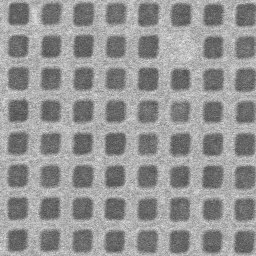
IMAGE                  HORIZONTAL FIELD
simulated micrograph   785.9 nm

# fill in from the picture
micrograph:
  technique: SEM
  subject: a regular array of holes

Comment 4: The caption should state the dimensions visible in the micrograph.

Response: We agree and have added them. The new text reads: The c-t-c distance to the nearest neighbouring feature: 0.0984 microns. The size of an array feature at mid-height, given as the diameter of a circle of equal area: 0.0749 um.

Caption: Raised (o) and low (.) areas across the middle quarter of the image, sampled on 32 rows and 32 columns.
oooooooooooooooooooooooooooooooo
oo.....oooo.....ooo.....ooo.....
oo......oo......oo......oo......
oo......oo......oo......oo......
oo......oo......oo......oo......
oo.....ooo......oo......oo......
ooo...ooooo....oooo....oooo....o
oooooooooooooooooooooooooooooooo
oooooooooooooooooooooooooooooooo
ooo....oooo....oooo....oooo.....
oo......oo......oo......oo......
oo......oo......oo......oo......
oo......oo......oo......oo......
oo......oo.....ooo.....ooo......
oo.....ooo.....ooo.....ooo.....o
oooooooooooooooooooooooooooooooo
oooooooooooooooooooooooooooooooo
oo.....oooo....oooo....ooooo...o
oo.....ooo......oo......oo......
oo.....ooo.....ooo......oo......
oo.....ooo.....ooo......oo......
oo.....ooo.....ooo......oo......
oo....oooo.....oooo....ooo.....o
oooooooooooooooooooooooooooooooo
oooooooooooooooooooooooooooooooo
ooo....oooo....oooo....oooo....o
oo.....ooo.....ooo......oo......
oo.....ooo.....ooo......oo......
oo......oo.....ooo......oo......
oo.....ooo.....ooo......oo......
oo.....ooo.....ooo.....ooo.....o
oooooooooooooooooooooooooooooooo